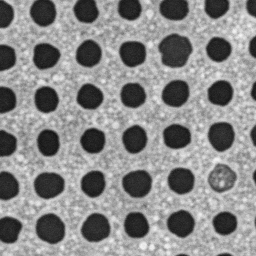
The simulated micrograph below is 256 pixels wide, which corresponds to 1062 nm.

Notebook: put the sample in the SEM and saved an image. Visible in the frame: a regular array of holes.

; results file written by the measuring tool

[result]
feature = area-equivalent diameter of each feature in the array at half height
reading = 113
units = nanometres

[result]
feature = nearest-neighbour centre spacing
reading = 176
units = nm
